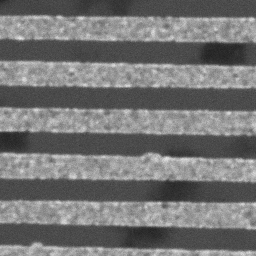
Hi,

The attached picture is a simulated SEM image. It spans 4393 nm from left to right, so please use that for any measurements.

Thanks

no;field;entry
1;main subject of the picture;lines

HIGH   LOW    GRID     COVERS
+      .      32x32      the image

................................
................................
++++++++++++++++++++++++++++++++
++++++++++++++++++++++++++++++++
++++++++++++++++++++++++++++++++
................................
................................
................................
++++++++++++++++++++++++++++++++
++++++++++++++++++++++++++++++++
++++++++++++++++++++++++++++++++
................................
................................
................................
++++++++++++++++++++++++++++++++
++++++++++++++++++++++++++++++++
..................++++++++++++++
................................
................................
+++++++.........................
++++++++++++++++++++++++++++++++
++++++++++++++++++++++++++++++++
.....................+.+++++++++
................................
................................
++++++++++++++++++++++++++++++++
++++++++++++++++++++++++++++++++
++++++++++++++++++++++++++++++++
...............................+
................................
................................
+++++++++++++++++++++++++++++...